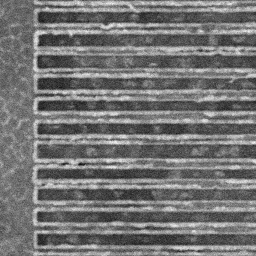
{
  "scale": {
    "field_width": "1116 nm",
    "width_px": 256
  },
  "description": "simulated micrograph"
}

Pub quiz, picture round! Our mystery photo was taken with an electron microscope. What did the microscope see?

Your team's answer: parallel lines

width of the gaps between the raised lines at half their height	51.8	nm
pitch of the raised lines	96.6	nm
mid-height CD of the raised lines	0.0436	microns